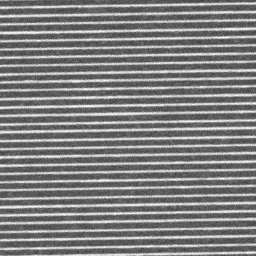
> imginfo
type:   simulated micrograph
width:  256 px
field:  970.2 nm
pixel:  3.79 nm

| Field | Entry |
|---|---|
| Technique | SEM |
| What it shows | parallel lines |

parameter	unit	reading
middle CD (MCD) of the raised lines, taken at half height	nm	5.7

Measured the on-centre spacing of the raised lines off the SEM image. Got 31.5 nm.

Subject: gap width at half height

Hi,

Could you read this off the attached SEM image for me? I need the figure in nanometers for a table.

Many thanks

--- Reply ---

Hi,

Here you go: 24.6